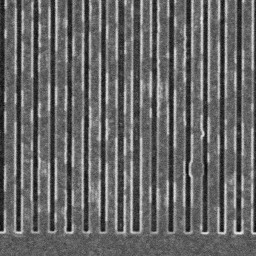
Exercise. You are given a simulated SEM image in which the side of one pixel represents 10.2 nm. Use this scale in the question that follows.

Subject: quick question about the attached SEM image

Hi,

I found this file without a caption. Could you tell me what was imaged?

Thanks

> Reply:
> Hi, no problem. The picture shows parallel lines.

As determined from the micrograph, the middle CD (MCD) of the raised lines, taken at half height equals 117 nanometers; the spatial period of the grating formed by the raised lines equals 172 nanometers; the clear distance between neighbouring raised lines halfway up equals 0.0585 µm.